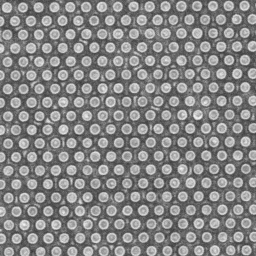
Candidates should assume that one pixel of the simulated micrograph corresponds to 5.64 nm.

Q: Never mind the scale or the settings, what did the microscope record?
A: a regular array of raised bodies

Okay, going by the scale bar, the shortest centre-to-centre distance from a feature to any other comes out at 87.6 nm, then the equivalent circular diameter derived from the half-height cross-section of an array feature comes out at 51.3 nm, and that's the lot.